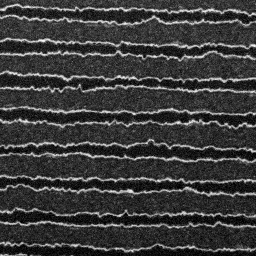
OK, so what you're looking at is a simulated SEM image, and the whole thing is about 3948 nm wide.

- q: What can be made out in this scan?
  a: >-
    parallel lines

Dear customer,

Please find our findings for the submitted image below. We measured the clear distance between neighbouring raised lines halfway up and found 168 nanometers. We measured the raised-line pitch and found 33.9 px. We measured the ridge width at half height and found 349 nanometres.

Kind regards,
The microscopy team